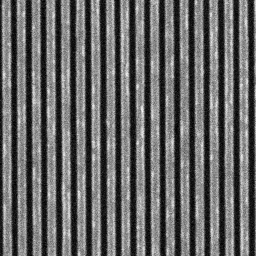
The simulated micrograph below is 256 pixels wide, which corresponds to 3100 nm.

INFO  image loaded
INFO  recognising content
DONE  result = parallel lines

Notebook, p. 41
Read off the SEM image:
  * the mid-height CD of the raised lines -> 0.0953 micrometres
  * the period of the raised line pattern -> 179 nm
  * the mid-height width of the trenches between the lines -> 83.2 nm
